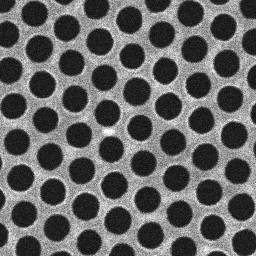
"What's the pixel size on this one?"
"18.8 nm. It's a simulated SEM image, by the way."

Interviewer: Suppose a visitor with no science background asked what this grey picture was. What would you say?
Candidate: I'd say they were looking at a regular array of holes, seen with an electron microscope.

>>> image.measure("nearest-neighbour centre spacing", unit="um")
0.663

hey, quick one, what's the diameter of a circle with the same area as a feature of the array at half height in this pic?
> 516 nm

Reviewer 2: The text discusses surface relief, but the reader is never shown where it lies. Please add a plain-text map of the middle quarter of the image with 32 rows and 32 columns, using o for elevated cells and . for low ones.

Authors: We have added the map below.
.....ooo....ooo....ooo......oooo
.....oo......oooo.oooo.......ooo
....ooo......ooooooooo.......ooo
ooooooo......oooo..ooo......ooo.
ooooooo......ooo.....oo....ooo..
o...oooo.....oo.......oooooooo..
.....ooo....ooo.......oooooooo..
......ooooooooo.......ooo...ooo.
......ooooooooo......oo......ooo
......ooo....ooo.....oo.......oo
......oo......ooo..oooo.......oo
o....ooo......ooooooooo.......oo
ooooooo.......ooooooooo......ooo
oooooooo......ooo....ooo....ooo.
oooo.ooo.....ooo......ooooooooo.
o.....oooo..oooo......ooooooooo.
o......ooooooooo......oooo...ooo
.......ooooooooo......ooo.....oo
.......ooo....ooo....ooo......oo
o......oo......ooooooooo.......o
oo....ooo......ooooooooo.......o
ooooooooo......ooooo.ooo......oo
ooooooooo......oo.....ooo....ooo
ooo...ooo.....ooo......ooooooooo
oo.....oooo..oooo......ooooooooo
o.......oooooooo.......oooo...oo
o.......ooooooooo......oo......o
o.......ooo....ooo....ooo......o
oo.....ooo......ooooooooo.......
oo....ooo.......ooooooooo......o
ooooooooo.......oooo.oooo......o
.oooooooo.......oo.....ooo....oo